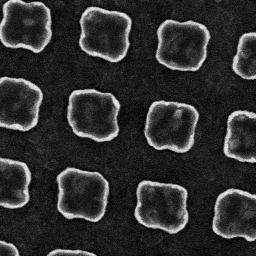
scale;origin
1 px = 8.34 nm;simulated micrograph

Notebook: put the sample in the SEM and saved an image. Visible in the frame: raised bodies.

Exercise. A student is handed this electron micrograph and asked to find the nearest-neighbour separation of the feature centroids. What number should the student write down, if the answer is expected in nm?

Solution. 652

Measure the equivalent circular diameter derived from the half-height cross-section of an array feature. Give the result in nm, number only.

433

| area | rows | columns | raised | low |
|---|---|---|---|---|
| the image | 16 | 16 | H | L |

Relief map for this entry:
HHHLLLLLLLLLLLLL
HHHLLHHHLLHHLLLL
HHHLLHHHLLHHHLLH
LLLLLLHHLLHHHLLH
LLLLLLLLLLLLLLLH
HHLLLLLLLLLLLLLL
HHLLHHHLLLHLLLLL
HHLLHHHLLHHHLLHH
LLLLLHHLLHHHLLHH
LLLLLLLLLLLLLLHH
HHLLLLLLLLLLLLLL
HHLLHHHLLHLLLLLL
HHLLHHHLLHHHLLHH
LLLLHHLLLHHHLHHH
LLLLLLLLLLLLLLHH
HLLLLLLLLLLLLLLL